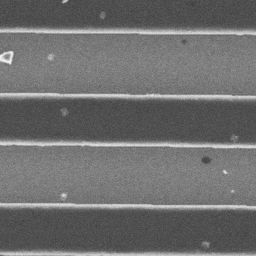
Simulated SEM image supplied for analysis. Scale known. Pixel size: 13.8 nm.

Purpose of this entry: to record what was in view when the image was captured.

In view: lines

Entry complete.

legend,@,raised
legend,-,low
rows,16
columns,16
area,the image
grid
@@@@@@@@@@@@@@@@
@@@@@@@@@@@@@@@@
----------------
----------------
----------------
----------------
@@@@@@@@@@@@@@@@
@@@@@@@@@@@@@@@@
@@@@@@@@@@@@@@@@
----------------
----------------
----------------
----------------
@@@@@@@@@@@@@@@@
@@@@@@@@@@@@@@@@
@@@@@@@@@@@@@@@@